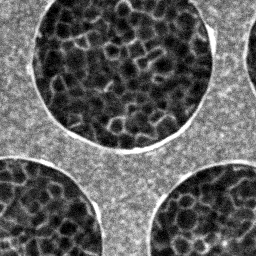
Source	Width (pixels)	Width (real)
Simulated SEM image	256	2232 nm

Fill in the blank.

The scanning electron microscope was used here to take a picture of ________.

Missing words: holes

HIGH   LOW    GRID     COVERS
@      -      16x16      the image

@@@---------@@@@
@@-----------@@@
@@-----------@@-
@@-----------@@-
@@-----------@@-
@@-----------@@@
@@@----------@@@
@@@---------@@@@
@@@@@------@@@@@
@@@@@@@@@@@@@@@@
---@@@@@@@@@@---
-----@@@@@@-----
------@@@@------
------@@@@------
------@@@-------
------@@@-------